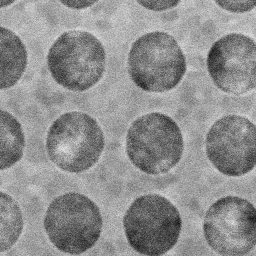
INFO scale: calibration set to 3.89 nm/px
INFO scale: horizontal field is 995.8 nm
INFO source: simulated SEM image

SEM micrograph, holes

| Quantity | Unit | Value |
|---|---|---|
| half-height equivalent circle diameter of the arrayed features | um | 0.239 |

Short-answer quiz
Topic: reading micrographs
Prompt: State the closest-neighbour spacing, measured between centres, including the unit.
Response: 310 nm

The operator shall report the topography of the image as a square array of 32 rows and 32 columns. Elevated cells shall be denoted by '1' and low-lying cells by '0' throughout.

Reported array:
00111111000011111000001111100000
11111111111111111111111111110001
11111111111111111111111111111111
01111111111111111111111111111111
00111110000011111000001111110001
00011100000001111000001111100000
00011100000001110000000111000000
00001100000001110000000111000000
00011100000001110000000111000000
00011100000001110000000111000000
00111110000011111000001111100000
11111111101111111100011111110001
11111111111111111111111111111111
11111111111111111111111111111111
00111110000111111000011111110001
00011100000011110000001111100000
00011100000001110000000111000000
00011100000001110000000111000000
00011100000001110000000111000000
00011100000001110000000111000000
00111110000011110000001111000000
11111111001111111100011111100001
11111111111111111111111111111111
11111111111111111111111111111111
01111110000111111000011111110011
00111100000011110000001111000000
00011100000001110000001111000000
00011000000001100000000110000000
00011000000001100000000110000000
00011100000001110000001110000000
00111100000011110000001111000000
11111111000111111000011111100001